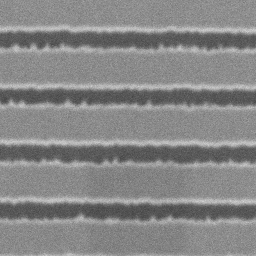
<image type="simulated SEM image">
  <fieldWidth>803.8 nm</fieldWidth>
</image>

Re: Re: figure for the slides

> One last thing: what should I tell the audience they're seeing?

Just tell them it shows lines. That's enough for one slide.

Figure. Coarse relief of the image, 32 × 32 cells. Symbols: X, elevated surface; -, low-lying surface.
XXXXXXXXXXXXXXXXXXXXXXXXXXXXXXXX
XXXXXXXXXXXXXXXXXXXXXXXXXXXXXXXX
XXXXXXXXXXXXXXXXXXXXXXXXXXXXXXXX
XXXXXXXXXXXXXXXXXXXXXXXXXXXXXXXX
--------------------------------
--------------------------------
XXXXXXXXXXXXXXXXXXXXXXXXXXXXXXXX
XXXXXXXXXXXXXXXXXXXXXXXXXXXXXXXX
XXXXXXXXXXXXXXXXXXXXXXXXXXXXXXXX
XXXXXXXXXXXXXXXXXXXXXXXXXXXXXXXX
XXXXXXXXXXXXXXXXXXXXXXXXXXXXXXXX
--------------------------------
--------------------------------
XXXXXXXXXXXXXXXXXXXXXXXXXXXXXXXX
XXXXXXXXXXXXXXXXXXXXXXXXXXXXXXXX
XXXXXXXXXXXXXXXXXXXXXXXXXXXXXXXX
XXXXXXXXXXXXXXXXXXXXXXXXXXXXXXXX
XXXXXXXXXXXXXXXXXXXXXXXXXXXXXXXX
--------------------------------
--------------------------------
XXXXXXXX--XX--XXXXXXXX---XX-XXX-
XXXXXXXXXXXXXXXXXXXXXXXXXXXXXXXX
XXXXXXXXXXXXXXXXXXXXXXXXXXXXXXXX
XXXXXXXXXXXXXXXXXXXXXXXXXXXXXXXX
XXXXXXXXXXXXXXXXXXXXXXXXXXXXXXXX
--------------------------------
--------------------------------
X-XX-X-XXXXX---------XX----XX--X
XXXXXXXXXXXXXXXXXXXXXXXXXXXXXXXX
XXXXXXXXXXXXXXXXXXXXXXXXXXXXXXXX
XXXXXXXXXXXXXXXXXXXXXXXXXXXXXXXX
XXXXXXXXXXXXXXXXXXXXXXXXXXXXXXXX